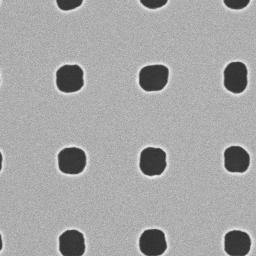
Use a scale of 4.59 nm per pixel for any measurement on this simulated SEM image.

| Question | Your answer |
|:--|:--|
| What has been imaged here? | holes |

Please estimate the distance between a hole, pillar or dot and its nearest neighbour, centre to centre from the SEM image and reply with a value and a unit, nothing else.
376 nanometers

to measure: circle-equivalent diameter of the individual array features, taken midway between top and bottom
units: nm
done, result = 133